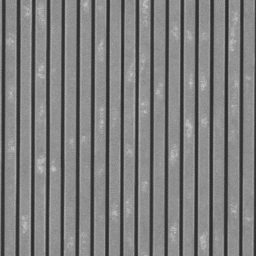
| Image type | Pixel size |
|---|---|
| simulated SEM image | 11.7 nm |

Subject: parallel lines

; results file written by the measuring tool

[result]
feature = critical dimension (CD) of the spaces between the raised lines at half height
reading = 45.2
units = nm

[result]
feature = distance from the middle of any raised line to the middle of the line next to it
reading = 0.174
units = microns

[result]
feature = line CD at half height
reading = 10.9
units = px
